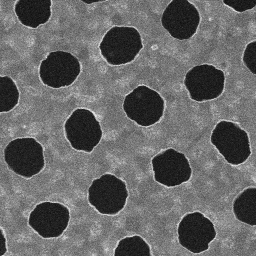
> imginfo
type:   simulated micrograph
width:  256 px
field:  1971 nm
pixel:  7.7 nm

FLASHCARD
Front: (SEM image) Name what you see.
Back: a regular array of holes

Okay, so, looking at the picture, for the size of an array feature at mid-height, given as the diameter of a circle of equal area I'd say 299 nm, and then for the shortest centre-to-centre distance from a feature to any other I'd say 0.501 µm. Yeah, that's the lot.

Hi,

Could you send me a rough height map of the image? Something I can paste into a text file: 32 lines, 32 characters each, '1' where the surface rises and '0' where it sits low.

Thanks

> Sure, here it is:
11000011111111111111100011110000
11000011111111111111000001111111
11000011111111111111000001111111
11111111111111000111100001111111
11111111111110000011100011111111
11111111111110000011111111111110
11111110111110000111111111111110
11111000001110001111111111111100
11111000001111111111111100011110
11111000001111111111111000001111
00111100011111111111111000001111
00111111111111110000111100001111
00111111111111110000111100111111
00111111111111100000111111111111
11111111100011110000111111111111
11111111000011111001111111100111
11111111000001111111111111100001
11001111100001111111111111000001
10000111100011111111111111100001
10000111111111111111000111110001
10000111111111111110000011111011
11000111111111111110000011111111
11111111111100011111000111111111
11111111111000001111111111111111
11111111111000001111111111111100
11111001111000001111111111111000
11110000011100011111111111111000
11110000011111111111111000111100
11110000111111111111110000011111
11111001111111111111110000011111
01111111111111100011111000111111
01111111111111000001111101111111